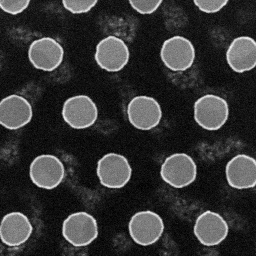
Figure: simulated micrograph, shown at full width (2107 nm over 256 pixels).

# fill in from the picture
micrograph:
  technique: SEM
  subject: a regular array of raised bodies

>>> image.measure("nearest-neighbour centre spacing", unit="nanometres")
538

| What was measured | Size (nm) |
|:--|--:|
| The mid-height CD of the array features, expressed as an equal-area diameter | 271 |